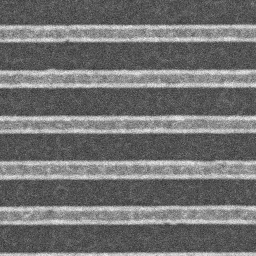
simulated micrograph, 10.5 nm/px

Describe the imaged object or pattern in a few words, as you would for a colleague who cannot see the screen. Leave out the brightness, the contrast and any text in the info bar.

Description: parallel lines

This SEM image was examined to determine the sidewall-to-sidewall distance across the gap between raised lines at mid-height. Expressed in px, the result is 32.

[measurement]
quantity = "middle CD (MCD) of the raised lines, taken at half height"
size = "143 nm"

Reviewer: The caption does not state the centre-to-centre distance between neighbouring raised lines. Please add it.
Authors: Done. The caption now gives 477 nm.